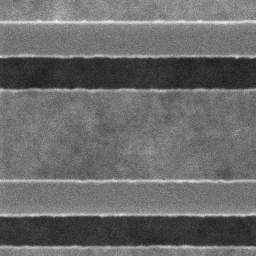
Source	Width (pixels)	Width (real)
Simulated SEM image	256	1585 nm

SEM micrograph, lines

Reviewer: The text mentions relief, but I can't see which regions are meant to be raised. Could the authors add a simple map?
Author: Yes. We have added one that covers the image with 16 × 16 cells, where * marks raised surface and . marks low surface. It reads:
****************
****************
****************
****************
................
................
****************
****************
****************
****************
****************
****************
****************
......*.........
................
****************